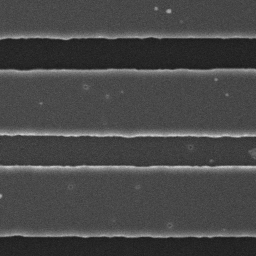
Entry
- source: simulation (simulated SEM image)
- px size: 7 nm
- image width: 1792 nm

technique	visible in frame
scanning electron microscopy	lines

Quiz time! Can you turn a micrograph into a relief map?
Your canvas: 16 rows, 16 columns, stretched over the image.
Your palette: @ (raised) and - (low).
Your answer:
@@@@@@@@@@@@@@@@
@@@@@@@@@@@@@@@@
----------------
----------------
@@@@@@@@@@@@@@@@
@@@@@@@@@@@@@@@@
@@@@@@@@@@@@@@@@
@@@@@@@@@@@@@@@@
@@@@@@@@@@@@@@@@
@@@@@@@@@@@@@@@@
@@@@@@@@@@@@@@@@
@@@@@@@@@@@@@@@@
@@@@@@@@@@@@@@@@
@@@@@@@@@@@@@@@@
@@@@@@@@@@@@@@@@
----------------